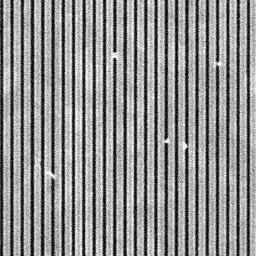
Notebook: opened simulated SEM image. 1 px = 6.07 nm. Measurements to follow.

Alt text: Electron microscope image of parallel lines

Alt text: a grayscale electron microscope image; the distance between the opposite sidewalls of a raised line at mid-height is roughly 39.4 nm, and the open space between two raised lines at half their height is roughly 22.7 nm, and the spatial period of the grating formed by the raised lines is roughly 62.3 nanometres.